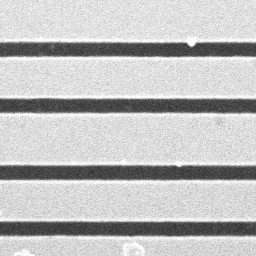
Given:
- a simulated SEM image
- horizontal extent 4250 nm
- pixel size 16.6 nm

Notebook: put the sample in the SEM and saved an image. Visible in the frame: lines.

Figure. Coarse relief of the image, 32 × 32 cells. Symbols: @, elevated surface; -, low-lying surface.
@@@@@@@@@@@@@@@@@@@@@@@@@@@@@@@@
@@@@@@@@@@@@@@@@@@@@@@@@@@@@@@@@
@@@@@@@@@@@@@@@@@@@@@@@@@@@@@@@@
@@@@@@@@@@@@@@@@@@@@@@@@@@@@@@@@
@@@@@@@@@@@@@@@@@@@@@@@@@@@@@@@@
-----------------------@--------
--------------------------------
@@@@@@@@@@@@@@@@@@@@@@@@@@@@@@@@
@@@@@@@@@@@@@@@@@@@@@@@@@@@@@@@@
@@@@@@@@@@@@@@@@@@@@@@@@@@@@@@@@
@@@@@@@@@@@@@@@@@@@@@@@@@@@@@@@@
@@@@@@@@@@@@@@@@@@@@@@@@@@@@@@@@
--------------------------------
--------------------------------
@@@@@@@@@@@@@@@@@@@@@@@@@@@@@@@@
@@@@@@@@@@@@@@@@@@@@@@@@@@@@@@@@
@@@@@@@@@@@@@@@@@@@@@@@@@@@@@@@@
@@@@@@@@@@@@@@@@@@@@@@@@@@@@@@@@
@@@@@@@@@@@@@@@@@@@@@@@@@@@@@@@@
@@@@@@@@@@@@@@@@@@@@@@@@@@@@@@@@
@@@@@@@@@@@@@@@@@@@@@@@@@@@@@@@@
--------------------------------
--------------------------------
@@@@@@@@@@@@@@@@@@@@@@@@@@@@@@@@
@@@@@@@@@@@@@@@@@@@@@@@@@@@@@@@@
@@@@@@@@@@@@@@@@@@@@@@@@@@@@@@@@
@@@@@@@@@@@@@@@@@@@@@@@@@@@@@@@@
@@@@@@@@@@@@@@@@@@@@@@@@@@@@@@@@
--------------------------------
-------@---@--------------------
@@@@@@@@@@@@@@@@@@@@@@@@@@@@@@@@
@@@@@@@@@@@@@@@@@@@@@@@@@@@@@@@@